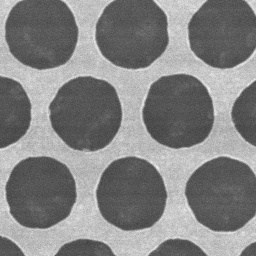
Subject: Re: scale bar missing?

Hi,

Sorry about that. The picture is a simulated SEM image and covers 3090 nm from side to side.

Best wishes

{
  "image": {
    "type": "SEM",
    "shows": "holes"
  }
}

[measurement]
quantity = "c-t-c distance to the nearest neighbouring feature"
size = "1.1 um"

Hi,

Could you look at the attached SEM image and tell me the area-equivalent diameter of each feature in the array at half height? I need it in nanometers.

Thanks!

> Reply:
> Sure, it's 895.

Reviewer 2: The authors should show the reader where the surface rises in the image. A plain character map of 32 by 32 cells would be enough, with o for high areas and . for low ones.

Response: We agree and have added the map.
oo......oooooo......ooooo......o
o........oooo........ooo........
o........ooo.........ooo........
o.........oo.........oo.........
o.........oo.........oo.........
o.........oo.........ooo........
o........ooo.........ooo........
oo.......oooo.......ooooo......o
oooo...oooooooo...ooooooooo..ooo
oooooooooo.ooooooooo....oooooooo
...ooooo......ooooo......oooooo.
...oooo........oooo.......oooo..
....ooo........ooo.........oo...
....oo.........ooo.........oo...
....oo.........ooo.........oo...
....oo.........ooo.........oo...
...oooo........ooo........oooo..
..oooooo......ooooo.......ooooo.
.oooooooo....oooooooo..ooooooooo
oooo..oooooooooo.ooooooooooooooo
oo......oooooo.....oooooo......o
o........oooo.......oooo........
o........ooo........ooo.........
o.........oo.........oo.........
o.........oo.........oo.........
o........ooo.........oo.........
o........ooo.........ooo........
oo......ooooo.......ooooo......o
ooo...ooooooooo....ooooooo....oo
oooooooooooooooooooooooooooooooo
..oooooo.....ooooooo....ooooooo.
...oooo.......ooooo.......oooo..